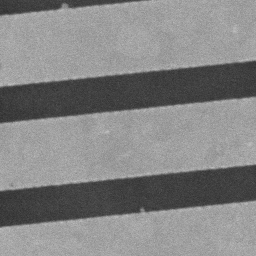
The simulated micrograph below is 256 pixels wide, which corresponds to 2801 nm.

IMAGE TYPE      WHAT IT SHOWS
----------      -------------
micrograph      lines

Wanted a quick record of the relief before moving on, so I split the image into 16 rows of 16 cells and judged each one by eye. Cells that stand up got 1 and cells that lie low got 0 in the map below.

0000011111111111
1111111111111111
1111111111111111
1111111111111111
1111111110000000
0000000000000000
0000000000001111
0011111111111111
1111111111111111
1111111111111111
1111111111111100
1111000000000000
0000000000000000
0000000111111111
1111111111111111
1111111111111111